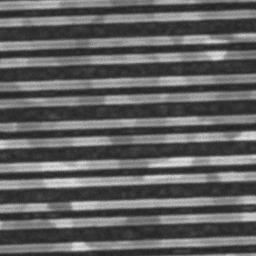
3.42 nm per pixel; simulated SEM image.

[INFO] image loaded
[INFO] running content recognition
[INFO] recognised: parallel lines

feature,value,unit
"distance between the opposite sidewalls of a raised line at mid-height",0.0252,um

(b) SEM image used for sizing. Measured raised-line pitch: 70.2 nm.